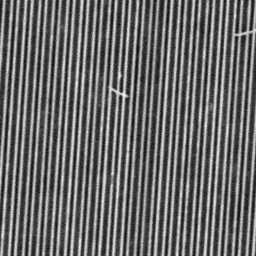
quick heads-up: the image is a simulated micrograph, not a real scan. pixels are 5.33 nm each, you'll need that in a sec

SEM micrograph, parallel lines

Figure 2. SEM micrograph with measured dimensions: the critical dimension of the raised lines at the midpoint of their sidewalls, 9.3 nanometers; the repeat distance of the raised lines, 37.2 nm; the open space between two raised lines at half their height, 27.2 nm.